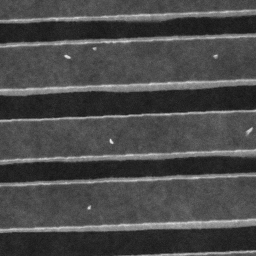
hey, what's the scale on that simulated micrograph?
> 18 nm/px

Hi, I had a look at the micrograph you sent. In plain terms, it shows lines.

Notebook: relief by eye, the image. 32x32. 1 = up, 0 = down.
11111111111111111111111111111111
11111111111111111111111111111110
11110000000000000000000000000000
00000000000000000000000000000000
00000000000000000000000000000011
00000011111111111111111111111111
11111111111111111111111111111111
11111111111111111111111111111111
11111111111111111111111111111111
11111111111111111111111111111111
11111111111111111111111100000000
00000000000000000000000000000000
00000000000000000000000000000000
00000000000000000000000000000000
00000000000000011111111111111111
11111111111111111111111111111111
11111111111111111111111111111111
11111111111111111111111111111111
11111111111111111111111111111111
11111111111111110000000000000000
00000000000000000000000000000000
00000000000000000000000000000000
00000000000000000111111111111111
11111111111111111111111111111111
11111111111111111111111111111111
11111111111111111111111111111111
11111111111111111111111111111111
11111111111111111111111111111111
11111111000000000000000000000000
00000000000000000000000000000000
00000000000000000000000000000000
00000000000000000000000000000011